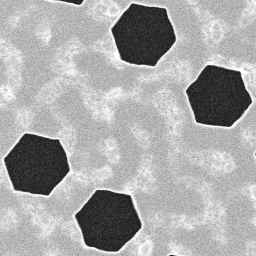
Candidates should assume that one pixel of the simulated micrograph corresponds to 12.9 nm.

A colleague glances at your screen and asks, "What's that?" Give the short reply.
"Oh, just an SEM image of holes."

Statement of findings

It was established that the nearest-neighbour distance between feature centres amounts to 1210 nm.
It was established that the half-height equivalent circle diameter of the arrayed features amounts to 792 nanometres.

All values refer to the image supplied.